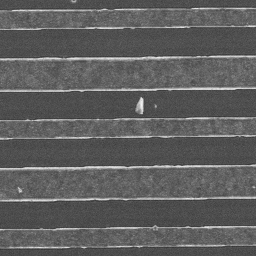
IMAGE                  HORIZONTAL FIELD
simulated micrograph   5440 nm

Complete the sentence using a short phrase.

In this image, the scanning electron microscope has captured lines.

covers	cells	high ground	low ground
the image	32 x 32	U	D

DDDDDDDDDDDDDDDDDDDDDDDDDDDDDDDD
UUUUUUUUUUUUUUUUUUUUUUUUUUUUUUUU
UUUUUUUUUUUUUUUUUUUUUUUUUUUUUUUU
UUUUUUUUUUUUUUUDDDDDDDDDDDDDDDDD
DDDDDDDDDDDDDDDDDDDDDDDDDDDDDDDD
DDDDDDDDDDDDDDDDDDDDDDDDDDDDDDDD
DDDDDDDDDDDDDDDDDDDDDDDDDDDDDDDD
UUUUUUUUUUUUUUUUUUUUUUUUUUUUUUUU
UUUUUUUUUUUUUUUUUUUUUUUUUUUUUUUU
UUUUUUUUUUUUUUUUUUUUUUUUUUUUUUUU
UUUUUUUUUUUUUUUUUUUUUUUUUUUUUUUU
DDDDDDDDDDDDDDDDDDDDDDDDDDDDDDDD
DDDDDDDDDDDDDDDDDDDDDDDDDDDDDDDD
DDDDDDDDDDDDDDDDDDDDDDDDDDDDDDDD
DDDDDDDDDDDDDDDDDDDDDDDDDDDDDDDD
UUUUUUUUUUUUUUUUUUUUUUUUUUUUUUUU
UUUUUUUUUUUUUUUUUUUUUUUUUUUUUUUU
DDDDDDDDDDDDDDDDDDDDDDDDDDDDDDDD
DDDDDDDDDDDDDDDDDDDDDDDDDDDDDDDD
DDDDDDDDDDDDDDDDDDDDDDDDDDDDDDDD
DDDDDDDDDDDDDDDDDDDDDDDDDDDDDDDD
UUUUUUUUUUUUUUUUUUUUUUUUUUUUUUUU
UUUUUUUUUUUUUUUUUUUUUUUUUUUUUUUU
UUUUUUUUUUUUUUUUUUUUUUUUUUUUUUUU
UUUUUUUUUUUUUUUUUUUUUUUUUUUUUUUU
DDDDDDDDDDDDDDDDDDDDDDDDDDDDDDDD
DDDDDDDDDDDDDDDDDDDDDDDDDDDDDDDD
DDDDDDDDDDDDDDDDDDDDDDDDDDDDDDDD
DDDDDDDDDDDDDUUUUUUUUUUUUUUUUUUU
UUUUUUUUUUUUUUUUUUUUUUUUUUUUUUUU
UUUUUUUUUUUUUUUUUUUUUUUUUUUUUUUU
DDDDDDDDDDDDDDDDDDDDDDDDDDDDDDDD